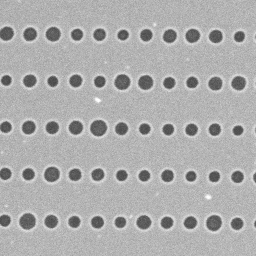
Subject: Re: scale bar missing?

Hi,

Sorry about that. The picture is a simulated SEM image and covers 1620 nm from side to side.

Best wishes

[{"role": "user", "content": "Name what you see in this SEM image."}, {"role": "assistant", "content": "a regular array of holes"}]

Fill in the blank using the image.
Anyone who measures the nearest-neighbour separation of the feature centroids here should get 146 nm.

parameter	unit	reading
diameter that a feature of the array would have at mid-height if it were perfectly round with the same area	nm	81.7